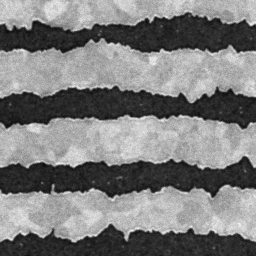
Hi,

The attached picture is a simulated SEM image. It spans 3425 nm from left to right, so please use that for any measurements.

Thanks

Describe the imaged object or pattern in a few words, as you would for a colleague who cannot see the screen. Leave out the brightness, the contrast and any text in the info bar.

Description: one or a few lines or trenches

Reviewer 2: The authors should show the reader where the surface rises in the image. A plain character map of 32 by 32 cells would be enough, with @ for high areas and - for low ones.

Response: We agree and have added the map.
@@@@@@@@@@@@@@@@@@@@@@@@@@@@@@@@
@@@@@@@@@@@@@@@@@@@@@@@@@@@@@@@@
@@@@-@@@@@@@@@@@@@----------@@-@
---@----@@----------------------
--------------------------------
-----------@@@------------------
-@@--@@--@@@@@@@@@--@@@@@@-@@-@@
@@@@@@@@@@@@@@@@@@@@@@@@@@@@@@@@
@@@@@@@@@@@@@@@@@@@@@@@@@@@@@@@@
@@@@@@@@@@@@@@@@@@@@@@@@@@@@@@@@
@@@@@@@@@@@@@@@@@@@@@@@@@@@@@@@@
@@@-@@@------------@@@@@@@@--@@@
--------------------------------
--------------------------------
--------------------------------
----@-@@@@@@@@@@@@@@@@@@@@@@@--@
@@@@@@@@@@@@@@@@@@@@@@@@@@@@@@@@
@@@@@@@@@@@@@@@@@@@@@@@@@@@@@@@@
@@@@@@@@@@@@@@@@@@@@@@@@@@@@@@@@
@@@@@@@@@@@@@@@@@@@@@@@@@@@@@@@@
@--@--@-@@----@---------@@@@@---
--------------------------------
--------------------------------
---------------------@------@@--
@@@@@@@@@@@@@--@@@@@@@@@@@-@@@@@
@@@@@@@@@@@@@@@@@@@@@@@@@@@@@@@@
@@@@@@@@@@@@@@@@@@@@@@@@@@@@@@@@
@@@@@@@@@@@@@@@@@@@@@@@@@@@@@@@@
@@@@@@@@@@@@@--@@@@@@@@@@@@@@@@@
@@---@-@@@@-------------------@@
--------------------------------
--------------------------------